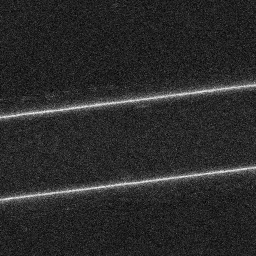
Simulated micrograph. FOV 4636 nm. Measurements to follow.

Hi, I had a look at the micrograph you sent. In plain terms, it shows one or a few lines or trenches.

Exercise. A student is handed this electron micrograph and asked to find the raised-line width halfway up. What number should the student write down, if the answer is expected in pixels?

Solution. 82.4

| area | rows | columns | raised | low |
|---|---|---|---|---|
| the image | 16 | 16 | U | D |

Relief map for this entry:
DDDDDDDDDDDDDDDD
DDDDDDDDDDDDDDDD
DDDDDDDDDDDDDDDD
DDDDDDDDDDDDDDDD
DDDDDDDDDDDDDDDD
DDDDDDDDDDDDDDUU
DDDDDDDUUUUUUUUU
UUUUUUUUUUUUUUUU
UUUUUUUUUUUUUUUU
UUUUUUUUUUUUUUUU
UUUUUUUUUUUUUUUU
UUUUUUUUDDDDDDDD
DDDDDDDDDDDDDDDD
DDDDDDDDDDDDDDDD
DDDDDDDDDDDDDDDD
DDDDDDDDDDDDDDDD